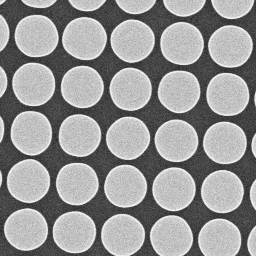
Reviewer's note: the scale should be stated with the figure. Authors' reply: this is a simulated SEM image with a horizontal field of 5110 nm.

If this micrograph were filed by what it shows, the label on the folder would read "an array of small figures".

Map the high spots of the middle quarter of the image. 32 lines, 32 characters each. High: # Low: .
................................
..######.......####.............
#########....#######......######
#########...#########....#######
##########..#########...########
##########..##########..########
##########..##########..########
##########..##########..########
#########...#########...########
.#######....#########...########
...####......#######.....#######
...............##.........#####.
................................
.######........###..............
########.....#######......####..
#########...########....########
#########..##########..#########
#########..##########..#########
#########..##########..#########
#########..##########..#########
#########..##########..#########
########....########...#########
.#####......#######.....########
..............####.......######.
................................
######........###...............
#######.....#######......#####..
########...########.....#######.
########...#########...#########
########..##########...#########
########..###########.##########
########..###########.##########